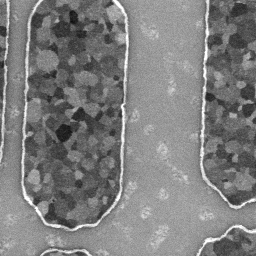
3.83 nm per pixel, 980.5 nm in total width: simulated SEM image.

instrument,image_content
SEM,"one or a few lines or trenches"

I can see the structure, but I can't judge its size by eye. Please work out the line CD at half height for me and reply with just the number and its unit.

377 nm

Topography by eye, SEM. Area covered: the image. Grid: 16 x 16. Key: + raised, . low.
..++++++.....+++
..++++++.....+++
..++++++.....+++
..++++++.....+++
..++++++.....+++
..++++++.....+++
..++++++.....+++
..++++++.....+++
..++++++.....+++
.+++++++.....+++
.+++++++.....+++
.+++++++.....+++
..+++++.......++
...+++..........
..............++
.............+++